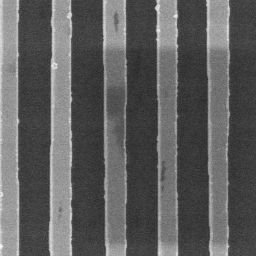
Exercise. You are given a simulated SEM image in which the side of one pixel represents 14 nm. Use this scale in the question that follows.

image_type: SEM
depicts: lines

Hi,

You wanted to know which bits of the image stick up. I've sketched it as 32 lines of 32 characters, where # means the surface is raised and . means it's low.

##.....##....###....##....###...
##.....##....###....##....###...
##....###....###....##....###...
##....###....###....##....###...
##.....##....###....##....###...
##.....##....###....##....###...
##.....##....###....##....###...
##.....##....###....##....###...
##....###....###....##....###...
##....###....###....##....###...
##....###....###....##....###...
##....###....###....##....###...
##....###....###....##....###...
##....###....###....##....###...
##....###....###....##....###...
##....###....###....##....###...
##....###....###....##....###...
##....###....###....##....##....
##....###....###....##....##....
##....###....###....##....##....
##....###....###....##....##....
##....###....###....##....##....
##....###....###....##....###...
##....###....###....##....##....
##....###....###....##....##....
##....###....###....##....##....
##....###....###....##....##....
##....###....###....##....##....
##....###....###....##....###...
##....###....###....##....###...
##....###....###....##....###...
##....###....###....##....##....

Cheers